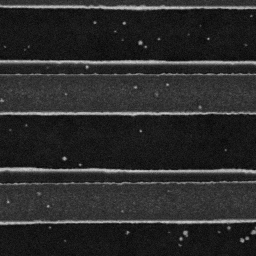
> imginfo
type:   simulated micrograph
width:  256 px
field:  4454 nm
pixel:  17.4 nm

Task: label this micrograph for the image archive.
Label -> lines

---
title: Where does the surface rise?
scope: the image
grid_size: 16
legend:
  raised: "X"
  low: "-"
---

----------------
----------------
----------------
----------------
XXXXXXXXXXXXXXXX
XXXXXXXXXXXXXXXX
XXXXXXXXXXXXXXXX
----------------
----------------
----------------
----------------
XXXXXXXXXXXXXXXX
XXXXXXXXXXXXXXXX
XXXXXXXXXXXXXXXX
----------------
----------------